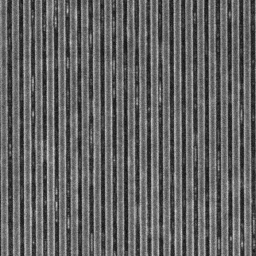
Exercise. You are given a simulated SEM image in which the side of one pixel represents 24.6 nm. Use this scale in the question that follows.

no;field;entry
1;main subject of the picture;parallel lines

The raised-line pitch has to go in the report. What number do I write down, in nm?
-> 284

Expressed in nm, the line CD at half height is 163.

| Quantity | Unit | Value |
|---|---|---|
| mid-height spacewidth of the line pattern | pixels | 5.25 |